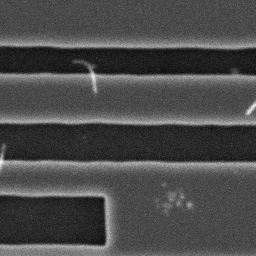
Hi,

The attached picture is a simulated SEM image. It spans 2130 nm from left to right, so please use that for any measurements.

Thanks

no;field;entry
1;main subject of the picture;groups of lines, slits or small figures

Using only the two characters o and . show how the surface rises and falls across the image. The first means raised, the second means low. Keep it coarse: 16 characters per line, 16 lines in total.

oooooooooooooooo
oooooooooooooooo
oooooooooooooooo
................
................
oooooooooooooooo
oooooooooooooooo
oooooooooooooooo
................
................
oooooooooooooooo
oooooooooooooooo
......oooooooooo
.......ooooooooo
.......ooooooooo
oooooooooooooooo